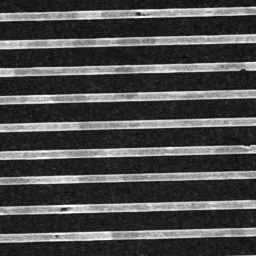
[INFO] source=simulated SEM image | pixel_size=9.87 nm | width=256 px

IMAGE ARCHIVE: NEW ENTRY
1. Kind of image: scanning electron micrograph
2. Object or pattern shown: parallel lines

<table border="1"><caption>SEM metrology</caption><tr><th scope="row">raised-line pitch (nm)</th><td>273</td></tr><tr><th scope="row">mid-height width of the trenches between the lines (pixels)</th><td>19.7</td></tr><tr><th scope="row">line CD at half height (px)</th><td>7.87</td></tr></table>